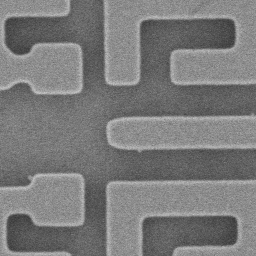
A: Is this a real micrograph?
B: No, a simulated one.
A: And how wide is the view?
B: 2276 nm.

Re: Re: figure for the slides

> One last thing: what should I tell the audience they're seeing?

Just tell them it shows wiring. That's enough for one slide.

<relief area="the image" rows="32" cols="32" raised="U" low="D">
UUUUUUUUUDDDDUUUUUUUUUUUUUUUUUUU
UUUUUUUUDDDDDUUUUUUUUUUUUUUUUUUU
UDDDDDDDDDDDDUUUUUDDDDDDDDDDDUUU
UDDDDDDDDDDDDUUUUDDDDDDDDDDDDDUU
UDDDDDDDDDDDDUUUUDDDDDDDDDDDDDUU
UDDDDUUUUDDDDUUUUDDDDDDDDDDDDUUU
UDDDUUUUUUDDDUUUUDDDDDUUUUUUUUUU
UUUUUUUUUUDDDUUUUDDDDUUUUUUUUUUU
UUUUUUUUUUDDDUUUUDDDDUUUUUUUUUUU
UUUUUUUUUUDDDUUUUDDDDUUUUUUUUUUU
UUDUUUUUUUDDDDUUUDDDDDUUUUUUUUUD
DDDDUUUUUUDDDDDDDDDDDDDDDDDDDDDD
DDDDDDDDDDDDDDDDDDDDDDDDDDDDDDDD
DDDDDDDDDDDDDDDDDDDDDDDDDDDDDDDD
DDDDDDDDDDDDDDDDDDDDDDDDDDDDDDDU
DDDDDDDDDDDDDDUUUUUUUUUUUUUUUUUU
DDDDDDDDDDDDDUUUUUUUUUUUUUUUUUUU
DDDDDDDDDDDDDDUUUUUUUUUUUUUUUUUU
DDDDDDDDDDDDDDDUUUUUUUUDDDDDDDDD
DDDDDDDDDDDDDDDDDDDDDDDDDDDDDDDD
DDDDDDDDDDDDDDDDDDDDDDDDDDDDDDDD
DDDDDDDDDDDDDDDDDDDDDDDDDDDDDDDD
DDDDUUUUUUDDDDDDDDDDDDDDDDDDDDDD
UUUUUUUUUUDDDUUUUUUUUUUUUUUUUUUU
UUUUUUUUUUDDDUUUUUUUUUUUUUUUUUUU
UUUUUUUUUUDDDUUUUUUUUUUUUUUUUUUU
UUUUUUUUUUDDDUUUUUUUUUUUUUUUUUUU
UDDDUUUUUUDDDUUUUUDDDDDDDDDDDDUU
UDDDDDDDDDDDDUUUUUDDDDDDDDDDDDUU
UDDDDDDDDDDDDUUUUUDDDDDDDDDDDDUU
UDDDDDDDDDDDDUUUUUDDDDDDDDDDDUUU
UUDDDDDDDDDDDUUUUUDDDDUUUUUUUUUU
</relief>